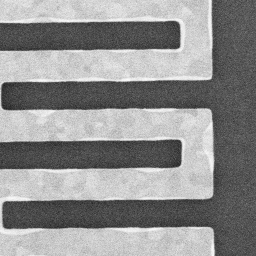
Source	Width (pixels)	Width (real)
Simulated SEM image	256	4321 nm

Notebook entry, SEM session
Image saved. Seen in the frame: groups of lines, slits or small figures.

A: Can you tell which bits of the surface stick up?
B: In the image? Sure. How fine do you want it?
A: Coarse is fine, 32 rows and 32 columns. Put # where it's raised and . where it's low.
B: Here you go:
##########################......
##########################......
#####.#########.......####......
.......................###......
.......................###......
.......................###......
##########################......
##########################......
##########################......
##########################......
................................
................................
................................
................................
##########################......
##########################......
##########################......
##########.............###......
.......................###......
.......................###......
.......................###......
###########################.....
###########################.....
###########################.....
##########################......
................................
................................
................................
.....................#####......
###########################.....
###########################.....
###########################.....